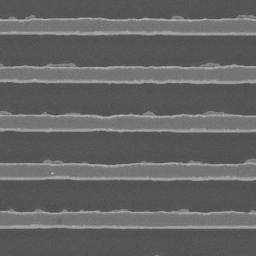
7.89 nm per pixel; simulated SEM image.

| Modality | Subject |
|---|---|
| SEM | lines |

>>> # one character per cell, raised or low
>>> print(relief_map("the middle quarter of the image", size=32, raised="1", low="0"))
00000000000000000000000000000000
11111111111111111111111111111111
11111111111111111111111111111111
11111111111111111111111111111111
11111111111111111111111111111111
00000000000000000000000000000000
00000000000000000000000000000000
00000000000000000000000000000000
00000000000000000000000000000000
00000000000000000000000000000000
00000000000000000000000000000000
00000000000000000000000000000000
00000000000000000000000000000000
11111111111111111111111111111111
11111111111111111111111111111111
11111111111111111111111111111111
11111111111111111111111111111111
00000000000000000000000000000000
00000000000000000000000000000000
00000000000000000000000000000000
00000000000000000000000000000000
00000000000000000000000000000000
00000000000000000000000000000000
00000000000000000000000000000000
00000000000000000000000000000000
11111111111111111111111111111111
11111111111111111111111111111111
11111111111111111111111111111111
11111111111111111111111111111111
00000000000000000000000000000000
00000000000000000000000000000000
00000000000000000000000000000000